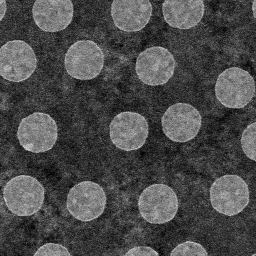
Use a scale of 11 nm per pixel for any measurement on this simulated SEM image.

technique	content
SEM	a regular array of raised bodies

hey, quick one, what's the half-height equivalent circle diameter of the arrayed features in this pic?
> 39 pixels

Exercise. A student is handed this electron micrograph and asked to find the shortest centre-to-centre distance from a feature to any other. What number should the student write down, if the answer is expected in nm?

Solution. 693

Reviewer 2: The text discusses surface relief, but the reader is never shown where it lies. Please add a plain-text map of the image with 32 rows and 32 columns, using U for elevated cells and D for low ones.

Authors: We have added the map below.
UDDDUUUUUDDDDDUUUUUDUUUUUDDDDDDD
UDDDUUUUUDDDDDUUUUUDUUUUUDDDDDDD
DDDDUUUUUDDDDDUUUUUDDUUUUDDDDDDD
DDDDDUUUDDDDDDDUUUDDDDUUDDDDDDDD
DDDDDDDDDDDDDDDDDDDDDDDDDDDDDDDD
DUUDDDDDDUUUDDDDDDDDDDDDDDDDDDDD
UUUUDDDDUUUUUDDDDDUUUDDDDDDDDDDD
UUUUDDDDUUUUUDDDDUUUUUDDDDDDDDDD
UUUUDDDDUUUUUDDDDUUUUUDDDDDDDDDD
UUUUDDDDDUUUDDDDDUUUUDDDDDDUUUUD
DDDDDDDDDDDDDDDDDDUUDDDDDDDUUUUU
DDDDDDDDDDDDDDDDDDDDDDDDDDDUUUUU
DDDDDDDDDDDDDDDDDDDDDDDDDDDUUUUD
DDDDDDDDDDDDDDDDDDDDDUUUDDDDDDDD
DDDDUUDDDDDDDDDUUUDDUUUUUDDDDDDD
DDDUUUUDDDDDDDUUUUDDUUUUUDDDDDDD
DDUUUUUDDDDDDDUUUUDDDUUUUDDDDDDU
DDUUUUUDDDDDDDUUUUDDDDUUDDDDDDUU
DDDUUUDDDDDDDDDUUDDDDDDDDDDDDDUU
DDDDDDDDDDDDDDDDDDDDDDDDDDDDDDDU
DDDDDDDDDDDDDDDDDDDDDDDDDDDDDDDD
DDDDDDDDDDDDDDDDDDDDDDDDDDDDDDDD
DUUUUDDDDDDDDDDDDDDDDDDDDDDUUUDD
DUUUUDDDDUUUUDDDDDUUUDDDDDUUUUUD
DUUUUDDDUUUUUDDDDDUUUUDDDDUUUUUD
DUUUUDDDUUUUUDDDDUUUUUDDDDUUUUUD
DDUUDDDDDUUUUDDDDDUUUUDDDDDUUUDD
DDDDDDDDDDUDDDDDDDUUUDDDDDDDDDDD
DDDDDDDDDDDDDDDDDDDDDDDDDDDDDDDD
DDDDDDDDDDDDDDDDDDDDDDDDDDDDDDDD
DDDDDDUDDDDDDDDDDDDDDDDUUDDDDDDD
DDDDDUUUUDDDDDDDUUUDDDUUUUDDDDDD